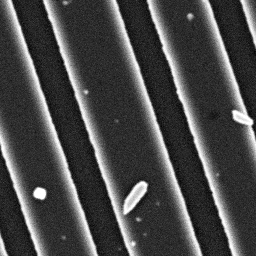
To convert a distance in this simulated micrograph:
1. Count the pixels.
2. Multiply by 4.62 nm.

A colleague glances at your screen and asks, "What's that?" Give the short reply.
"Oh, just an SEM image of lines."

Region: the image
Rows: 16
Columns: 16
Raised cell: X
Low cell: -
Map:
X--XXXX--XXXX--X
X--XXXXX--XXX---
XX--XXXX--XXXX--
XX--XXXX--XXXX--
XX--XXXXX--XXXX-
XXX--XXXX--XXXX-
XXX--XXXX--XXXX-
XXX--XXXXX--XXXX
XXXX--XXXX--XXXX
XXXX--XXXX--XXXX
-XXX--XXXXX--XXX
-XXXX--XXXX--XXX
-XXXX--XXXX--XXX
--XXX--XXXXX--XX
--XXXX--XXXX--XX
--XXXX--XXXX--XX